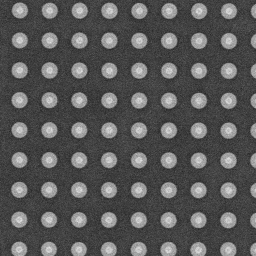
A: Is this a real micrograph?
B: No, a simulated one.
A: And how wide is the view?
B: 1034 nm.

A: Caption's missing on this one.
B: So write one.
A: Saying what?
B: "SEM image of an array of small figures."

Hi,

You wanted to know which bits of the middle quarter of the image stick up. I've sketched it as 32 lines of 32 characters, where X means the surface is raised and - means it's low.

--XXX-----XXX----XXX-----XXX----
--XXXX---XXXX----XXXX---XXXX----
--XXXX----XXX----XXXX----XXX----
--------------------------X-----
--------------------------------
--------------------------------
--------------------------------
---XX-----XX------XX-----XX-----
--XXXX----XXX----XXXX---XXXX----
--XXXX----XXX----XXXX---XXXX----
---XX-----XXX----XXX-----XXX----
--------------------------------
--------------------------------
--------------------------------
--------------------------------
--XXX-----XXX----XXX-----XXX----
--XXXX---XXXX----XXXX---XXXX----
--XXX-----XXX----XXX----XXXX----
--------------------------X-----
--------------------------------
--------------------------------
--------------------------------
---XX-----XX-----XXX-----XX-----
--XXXX---XXXX----XXXX---XXXX----
--XXXX---XXXX----XXXX---XXXX----
--XXX-----XX-----XXX-----XXX----
--------------------------------
--------------------------------
--------------------------------
--------------------------------
--XXX-----XXX----XXX----XXXX----
--XXXX---XXXX----XXXX---XXXX----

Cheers